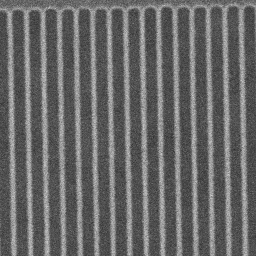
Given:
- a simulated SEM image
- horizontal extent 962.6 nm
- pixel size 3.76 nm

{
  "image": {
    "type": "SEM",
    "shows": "parallel lines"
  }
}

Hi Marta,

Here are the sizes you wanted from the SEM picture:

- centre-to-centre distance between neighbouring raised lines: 0.0621 um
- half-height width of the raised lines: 0.0146 microns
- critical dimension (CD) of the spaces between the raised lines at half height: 0.0474 micrometres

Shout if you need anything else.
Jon